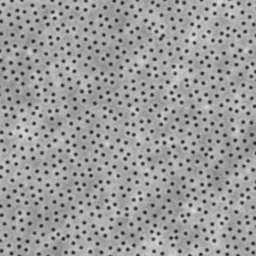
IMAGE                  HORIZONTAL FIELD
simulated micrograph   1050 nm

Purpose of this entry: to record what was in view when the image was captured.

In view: a regular array of holes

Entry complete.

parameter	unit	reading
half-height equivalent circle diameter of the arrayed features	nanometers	14.6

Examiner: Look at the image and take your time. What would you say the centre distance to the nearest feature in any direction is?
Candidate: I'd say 8.15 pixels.